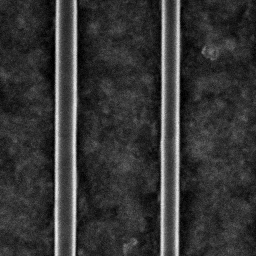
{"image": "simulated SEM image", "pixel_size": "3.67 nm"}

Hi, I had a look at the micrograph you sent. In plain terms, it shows one or a few lines or trenches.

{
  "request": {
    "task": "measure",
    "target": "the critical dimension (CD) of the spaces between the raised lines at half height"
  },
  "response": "321 nm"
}